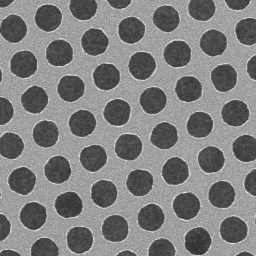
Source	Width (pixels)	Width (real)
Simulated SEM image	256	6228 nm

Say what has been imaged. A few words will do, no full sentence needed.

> a regular array of holes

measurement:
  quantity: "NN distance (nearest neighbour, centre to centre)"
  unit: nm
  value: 891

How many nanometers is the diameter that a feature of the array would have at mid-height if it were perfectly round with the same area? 676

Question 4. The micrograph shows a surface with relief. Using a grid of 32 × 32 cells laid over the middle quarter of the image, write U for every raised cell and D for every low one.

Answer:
UUUUUUUUDDDDDUUUDDDDDDDUUUUDDDUU
UUUUUUUUDDDDDDUUDDDDDDDUUUUUUUUU
UUUUUUUDDDDDDDUUUDDDDDUUUUUUUUUU
DDDDUUUDDDDDDDUUUDDDDUUUUUUUUDDD
DDDDDUUDDDDDDDUUUUUUUUUUUUUUDDDD
DDDDDUUUDDDDDUUUUUUUUUUUUUUUDDDD
DDDDDUUUUUDDUUUUUUUUDDDDDUUUDDDD
DDDDDUUUUUUUUUUUUUUDDDDDDUUUDDDD
DDDDUUUUUUUUUUUUUUUDDDDDDDUUDDDD
UDUUUUUUUUUDDDDDUUUDDDDDDDUUUUDU
UUUUUUUUUUDDDDDDDUUDDDDDDUUUUUUU
UUUUDDUUUUDDDDDDDUUUDDDDDUUUUUUU
UUDDDDDUUUDDDDDDDUUUUDDUUUUUUUUU
UDDDDDDDUUDDDDDDUUUUUUUUUUUUUUUD
UDDDDDDDUUUDDDDDUUUUUUUUUDUUUUUD
UDDDDDDDUUUUUDUUUUUUUUUDDDDDUUUD
UUDDDDDUUUUUUUUUUUUUUUDDDDDDUUUD
UUDDDDDUUUUUUUUDDUUUUUDDDDDDUUUD
UUUUUUUUUUUUUDDDDDDUUDDDDDDDDUUU
UUUUUUUUUUUUUDDDDDDUUUDDDDDDUUUU
UUUUUUDDDUUUUDDDDDDDUUDDDDDUUUUU
UUUUDDDDDDUUUDDDDDDDUUUUUUUUUUUU
UUUUDDDDDDDUUDDDDDDUUUUUUUUUUUUU
UUUUDDDDDDDUUUDDDDUUUUUUUUUDDUUU
DUUUDDDDDDDUUUUUUUUUUUUUUDDDDDUU
DDUUDDDDDDUUUUUUUUUUUUUUUDDDDDDU
DDUUUDDDDUUUUUUUUDDDUUUUDDDDDDDU
DDUUUUUUUUUUUUUUDDDDDDUUDDDDDDDU
DUUUUUUUUUUUUUUUDDDDDDUUUDDDDDDU
UUUUUUUUDDDDUUUDDDDDDDUUUDDDDDUU
UUUUUUUDDDDDDUUUDDDDDDUUUUUUUUUU
UUUUUUUDDDDDDUUUDDDDDDUUUUUUUUUU